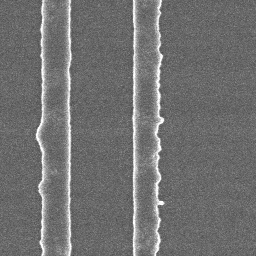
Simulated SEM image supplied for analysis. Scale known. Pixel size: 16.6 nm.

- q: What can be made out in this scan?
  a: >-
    one or a few lines or trenches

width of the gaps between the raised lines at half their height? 1070 nm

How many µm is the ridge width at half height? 0.437